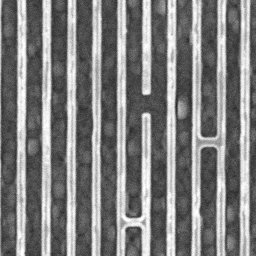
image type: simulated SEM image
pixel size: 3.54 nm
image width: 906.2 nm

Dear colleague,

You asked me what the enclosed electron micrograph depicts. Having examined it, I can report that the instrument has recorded parallel lines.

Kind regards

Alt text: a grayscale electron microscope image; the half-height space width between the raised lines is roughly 63.3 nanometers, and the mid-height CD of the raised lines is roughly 24.8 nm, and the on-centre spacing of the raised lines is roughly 87.9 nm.